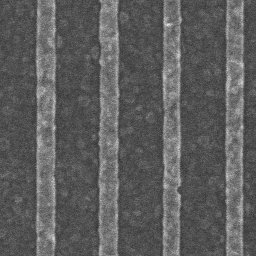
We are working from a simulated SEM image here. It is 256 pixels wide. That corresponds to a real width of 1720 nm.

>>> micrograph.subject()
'one or a few lines or trenches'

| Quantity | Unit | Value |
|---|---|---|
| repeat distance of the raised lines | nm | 422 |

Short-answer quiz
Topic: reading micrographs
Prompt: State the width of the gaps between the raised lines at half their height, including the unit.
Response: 309 nm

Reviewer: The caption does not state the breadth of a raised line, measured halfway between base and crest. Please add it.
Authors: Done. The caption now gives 109 nm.